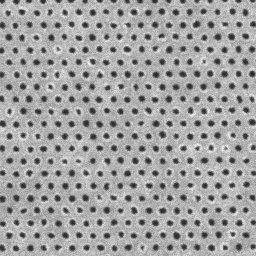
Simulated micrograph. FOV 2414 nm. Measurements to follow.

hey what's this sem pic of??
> a regular array of holes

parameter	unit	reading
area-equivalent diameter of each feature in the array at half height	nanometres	61.1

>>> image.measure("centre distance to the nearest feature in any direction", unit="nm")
126